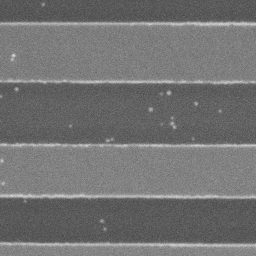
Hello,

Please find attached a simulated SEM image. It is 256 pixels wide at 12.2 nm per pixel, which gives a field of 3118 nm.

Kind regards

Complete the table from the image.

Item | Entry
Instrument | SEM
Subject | lines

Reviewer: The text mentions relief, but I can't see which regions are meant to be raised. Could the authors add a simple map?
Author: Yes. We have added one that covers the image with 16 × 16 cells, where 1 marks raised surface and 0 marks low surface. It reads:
0000000000000000
0000000000000000
1111111111111111
1111111111111111
1111111111111111
0000000000000000
0000000000000000
0000000000000000
0000000000000000
1111111111111111
1111111111111111
1111111111111111
0000000000000000
0000000000000000
0000000000000000
1111111111111111